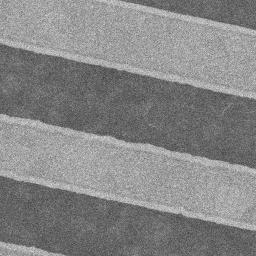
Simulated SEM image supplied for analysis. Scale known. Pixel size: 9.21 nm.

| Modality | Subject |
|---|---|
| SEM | one or a few lines or trenches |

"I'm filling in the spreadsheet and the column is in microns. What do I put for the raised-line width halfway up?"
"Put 0.516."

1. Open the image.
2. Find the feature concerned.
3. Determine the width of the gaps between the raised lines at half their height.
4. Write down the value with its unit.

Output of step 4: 687 nanometres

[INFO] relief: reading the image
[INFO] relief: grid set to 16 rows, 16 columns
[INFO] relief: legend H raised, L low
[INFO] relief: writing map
HHHHHHHHHLLLLLLL
HHHHHHHHHHHHHLLL
HHHHHHHHHHHHHHHH
LLLLHHHHHHHHHHHH
LLLLLLLLLHHHHHHH
LLLLLLLLLLLLLHHH
LLLLLLLLLLLLLLLL
HLLLLLLLLLLLLLLL
HHHHHLLLLLLLLLLL
HHHHHHHHHHLLLLLL
HHHHHHHHHHHHHHHL
LLLHHHHHHHHHHHHH
LLLLLLLLHHHHHHHH
LLLLLLLLLLLLHHHH
LLLLLLLLLLLLLLLL
HLLLLLLLLLLLLLLL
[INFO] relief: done